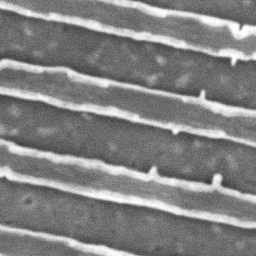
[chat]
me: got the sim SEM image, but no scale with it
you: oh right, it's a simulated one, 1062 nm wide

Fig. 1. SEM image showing one or a few lines or trenches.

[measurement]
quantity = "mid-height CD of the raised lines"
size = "32.5 px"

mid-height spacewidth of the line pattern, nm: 204